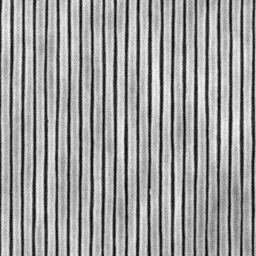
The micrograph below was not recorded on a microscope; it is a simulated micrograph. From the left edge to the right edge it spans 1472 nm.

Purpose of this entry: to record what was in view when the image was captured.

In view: parallel lines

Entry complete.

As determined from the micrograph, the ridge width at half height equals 0.046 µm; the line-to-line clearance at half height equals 20.1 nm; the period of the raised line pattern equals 66.2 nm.